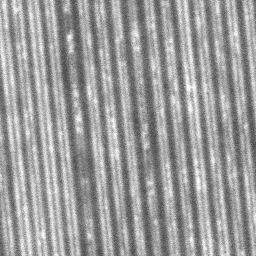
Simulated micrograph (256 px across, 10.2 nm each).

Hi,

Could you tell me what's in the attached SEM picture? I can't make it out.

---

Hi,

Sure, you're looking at parallel lines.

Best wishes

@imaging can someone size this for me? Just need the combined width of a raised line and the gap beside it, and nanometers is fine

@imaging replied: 167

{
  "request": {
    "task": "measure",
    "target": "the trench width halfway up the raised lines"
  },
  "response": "4.23 px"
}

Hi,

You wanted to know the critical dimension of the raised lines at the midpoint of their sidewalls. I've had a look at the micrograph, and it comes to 12.7 pixels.